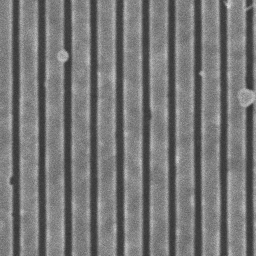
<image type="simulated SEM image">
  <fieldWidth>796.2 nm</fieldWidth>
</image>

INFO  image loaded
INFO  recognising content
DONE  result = parallel lines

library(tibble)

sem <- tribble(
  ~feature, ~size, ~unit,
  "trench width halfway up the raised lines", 0.0245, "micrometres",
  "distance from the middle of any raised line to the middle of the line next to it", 80.7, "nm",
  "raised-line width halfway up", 56.7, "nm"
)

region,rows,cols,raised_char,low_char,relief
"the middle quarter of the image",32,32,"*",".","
..****...****..****...****..****
..****...****..****...****..****
..****...****..****...****..****
..****...****..****...****..****
..****...****..****...****..****
..****...****..*****..****..****
..****...****..*****..****..****
..****...****..*****..****..****
..****...****..****...****..****
..****..*****..****...****..****
..****..*****..****...****..****
..****..*****..****...****..****
..****..*****..****...****..****
..****..*****..****...****..****
..****..*****..****...****..****
..****..*****..****...****..****
..****..*****..****...****..****
..****..*****..****...****..****
..****...****..****...****..****
..****...****..****...****..****
..****...****..****...****..****
..****...****..****...****..****
..****...****..****...****..****
..****...****..****...****..****
..****...****..****...****..****
..****...****..****...****..****
..****...****..****...****..****
..****...****..****...****..****
..****...****..****...****..****
..****...****..****...****..****
..****...****..****...****..****
..****...****..****...****..****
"